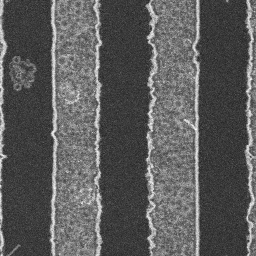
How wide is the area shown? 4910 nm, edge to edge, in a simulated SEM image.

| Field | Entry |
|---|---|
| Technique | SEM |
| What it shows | one or a few lines or trenches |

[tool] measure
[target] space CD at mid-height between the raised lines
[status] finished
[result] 1.01 µm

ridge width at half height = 860 nm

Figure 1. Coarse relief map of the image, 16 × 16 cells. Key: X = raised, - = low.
---XXX---XXX----
---XXX----XX----
---XXX---XXX----
---XXX----XX----
---XXX----XX----
---XXX---XXX----
---XXX----XX----
---XXX---XXX----
---XXX---XXX----
---XXX---XXX----
---XXX---XXX----
---XXX----XX----
---XXX---XXX----
---XXX---XXX----
---XXX----XX----
---XXX---XXX----